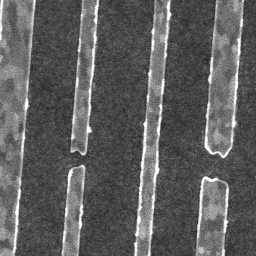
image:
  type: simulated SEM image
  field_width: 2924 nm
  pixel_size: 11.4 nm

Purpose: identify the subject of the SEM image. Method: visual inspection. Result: one or a few lines or trenches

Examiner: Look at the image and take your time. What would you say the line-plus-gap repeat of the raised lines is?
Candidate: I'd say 792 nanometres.